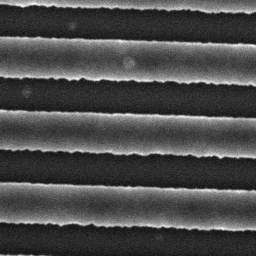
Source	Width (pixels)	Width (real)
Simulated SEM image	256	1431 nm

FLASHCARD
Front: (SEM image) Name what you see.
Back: lines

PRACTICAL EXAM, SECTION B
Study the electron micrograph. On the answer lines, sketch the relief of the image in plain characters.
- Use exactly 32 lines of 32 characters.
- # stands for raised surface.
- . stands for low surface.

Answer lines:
.###############################
..........................######
................................
................................
................................
###########################.....
################################
################################
################################
################################
...........................#####
................................
................................
................................
########################........
################################
################################
################################
################################
........................########
................................
................................
................................
####################............
################################
################################
################################
################################
.......................#########
................................
................................
................................